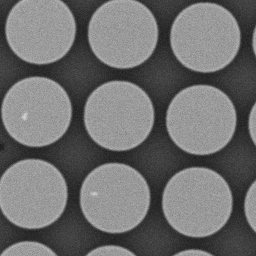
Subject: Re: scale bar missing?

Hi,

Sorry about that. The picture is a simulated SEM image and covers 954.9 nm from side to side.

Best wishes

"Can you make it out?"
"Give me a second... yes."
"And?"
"an array of small figures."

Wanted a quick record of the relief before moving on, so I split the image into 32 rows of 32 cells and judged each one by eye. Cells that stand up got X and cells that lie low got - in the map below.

--XXXXXX-----XXXXX-------XX-----
-XXXXXXXX---XXXXXXX----XXXXXX---
-XXXXXXXX--XXXXXXXX---XXXXXXX---
-XXXXXXXX--XXXXXXXXX-XXXXXXXXX--
-XXXXXXXX--XXXXXXXXX-XXXXXXXXX--
-XXXXXXXX--XXXXXXXXX-XXXXXXXXX--
--XXXXXX----XXXXXXX---XXXXXXXX--
---XXXX------XXXXX----XXXXXXX---
---------------X--------XXXX----
--------------------------------
--XXXXX------XXXX---------------
-XXXXXXX----XXXXXX-----XXXXX----
-XXXXXXXX--XXXXXXXX---XXXXXXX---
XXXXXXXXX--XXXXXXXX--XXXXXXXX---
XXXXXXXXX--XXXXXXXX--XXXXXXXX--X
-XXXXXXXX--XXXXXXXX--XXXXXXXX--X
-XXXXXXX---XXXXXXXX--XXXXXXXX--X
--XXXXX-----XXXXXX----XXXXXXX---
-------------XXXX------XXXXX----
--------------------------------
--XXXX-------XX-----------------
-XXXXXX-----XXXXX------XXXX-----
XXXXXXXX---XXXXXXX---XXXXXXX----
XXXXXXXX--XXXXXXXXX--XXXXXXXX--X
XXXXXXXX--XXXXXXXXX-XXXXXXXXX--X
XXXXXXXX--XXXXXXXXX-XXXXXXXXX--X
XXXXXXXX--XXXXXXXX--XXXXXXXXX--X
-XXXXXX----XXXXXXX---XXXXXXX---X
---XX-------XXXXX-----XXXXXX----
-----------------------XXX------
--XXX---------------------------
-XXXXXX----XXXXX-------XXX------